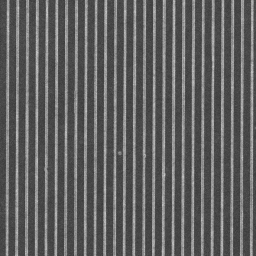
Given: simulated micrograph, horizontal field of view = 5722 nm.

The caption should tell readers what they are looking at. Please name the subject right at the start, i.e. parallel lines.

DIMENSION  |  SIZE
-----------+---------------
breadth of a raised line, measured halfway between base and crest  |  39.1 nm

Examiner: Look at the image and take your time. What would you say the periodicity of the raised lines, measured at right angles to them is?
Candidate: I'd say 218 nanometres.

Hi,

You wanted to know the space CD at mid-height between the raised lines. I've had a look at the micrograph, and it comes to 176 nm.